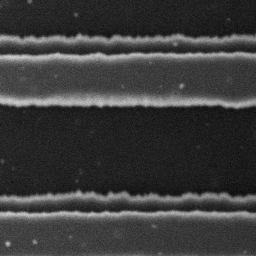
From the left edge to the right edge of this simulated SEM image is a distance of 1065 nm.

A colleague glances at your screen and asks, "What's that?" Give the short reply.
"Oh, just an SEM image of lines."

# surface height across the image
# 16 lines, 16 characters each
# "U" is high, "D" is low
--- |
DDDDDDDDDDDDDDDD
DDDDDDDDDDDDDDDD
UDDUDUDUDDUUDDUU
UUUUUUUUUUUUUUUU
UUUUUUUUUUUUUUUU
UUUUUUUUUUUUUUUU
DUUUUUUUUUUUUUUU
DDDDDDDDDDDDDDDD
DDDDDDDDDDDDDDDD
DDDDDDDDDDDDDDDD
DDDDDDDDDDDDDDDD
DDDDDDDDDDDDDDDD
UDUUUUUUUUUUUUUU
UUUUUUUUUUUUUUUU
UUUUUUUUUUUUUUUU
UUUUUUUUUUUUUUUU